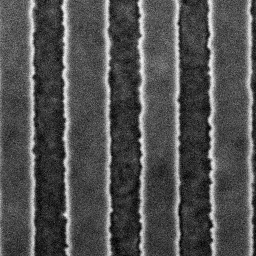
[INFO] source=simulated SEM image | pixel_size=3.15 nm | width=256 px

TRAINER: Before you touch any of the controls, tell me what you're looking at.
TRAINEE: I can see lines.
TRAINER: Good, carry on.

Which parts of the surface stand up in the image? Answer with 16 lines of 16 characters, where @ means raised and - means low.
@@--@@@--@@--@@@
@@--@@@--@@--@@@
@@--@@@--@@--@@@
@@--@@@--@@--@@@
@@--@@@--@@--@@@
@@--@@@--@@--@@@
@@--@@@--@@--@@@
@@--@@@--@@--@@@
@@--@@@--@@--@@@
@@--@@@--@@--@@@
@@--@@@--@@--@@@
@@--@@@--@@--@@@
@@--@@@--@@--@@@
@@--@@@--@@--@@@
@@--@@@--@@--@@@
@@--@@@--@@--@@@